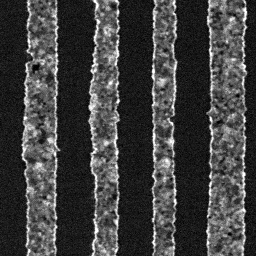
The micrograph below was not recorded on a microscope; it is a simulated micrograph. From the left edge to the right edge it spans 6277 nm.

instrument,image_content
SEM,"one or a few lines or trenches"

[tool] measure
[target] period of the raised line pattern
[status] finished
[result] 1520 nm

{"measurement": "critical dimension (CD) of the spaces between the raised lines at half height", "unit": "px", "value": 36.9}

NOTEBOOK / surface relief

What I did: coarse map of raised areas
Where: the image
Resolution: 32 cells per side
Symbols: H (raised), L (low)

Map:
LLLLHHHLLLLLHHHLLLLHHHLLLLHHHHHL
LLLLHHHLLLLLHHHLLLLHHHLLLLHHHHHL
LLLLHHHLLLLLHHHLLLLHHHLLLLHHHHHL
LLLHHHHLLLLLHHHLLLLHHHLLLLHHHHHL
LLLLHHHLLLLLHHHLLLLHHHLLLLHHHHLL
LLLLHHHLLLLLHHHLLLLHHHLLLLHHHHLL
LLLLHHHLLLLLHHHLLLLHHHLLLLHHHHLL
LLLLHHHLLLLLHHHLLLLHHHLLLLHHHHLL
LLLHHHHLLLLLHHHLLLLHHHLLLLHHHHHL
LLLHHHHLLLLLHHHLLLLHHHLLLLHHHHHL
LLLHHHHLLLLHHHHLLLLHHHLLLLHHHHLL
LLLHHHHLLLLHHHHLLLLHHHLLLLHHHHHL
LLLHHHHLLLLHHHHLLLLHHHLLLLHHHHHL
LLLHHHHLLLLHHHHLLLLHHHLLLLHHHHHL
LLLHHHHLLLLHHHHLLLLHHLLLLLHHHHHL
LLLHHHHLLLLHHHHLLLLHHLLLLLHHHHHL
LLLHHHHLLLLHHHHLLLLHHHLLLLHHHHHL
LLLHHHHLLLLLHHHLLLLHHHLLLLLHHHHL
LLLHHHHLLLLLHHHLLLLHHHLLLLHHHHHL
LLLHHHHLLLLLHHHLLLLHHHLLLLHHHHLL
LLLHHHHLLLLHHHLLLLLHHHLLLLHHHHLL
LLLHHHHLLLLLHHHLLLLHHHLLLLHHHHLL
LLLHHHHLLLLLHHHLLLLHHHLLLLHHHHLL
LLLHHHHLLLLLHHHLLLLHHHLLLLHHHHLL
LLLHHHHLLLLLHHHLLLLHHHLLLLHHHHHL
LLLLHHHLLLLLHHHLLLLHHHLLLLHHHHLL
LLLHHHHLLLLLHHHLLLLHHHLLLLHHHHLL
LLLHHHHLLLLLHHHLLLLHHHLLLLHHHHLL
LLLHHHHLLLLLHHHLLLLHHHLLLLHHHHHL
LLLLHHHLLLLLHHHLLLLHHHLLLLHHHHHL
LLLHHHHLLLLLHHHLLLLHHHLLLLHHHHLL
LLLLHHHLLLLLHHHLLLLHHHLLLLHHHHLL